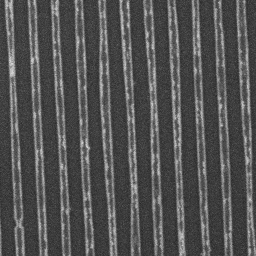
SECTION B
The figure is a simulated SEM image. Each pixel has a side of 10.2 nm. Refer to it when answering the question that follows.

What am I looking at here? parallel lines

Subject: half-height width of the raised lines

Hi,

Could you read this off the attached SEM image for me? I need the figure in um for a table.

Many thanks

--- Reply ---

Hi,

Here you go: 0.0711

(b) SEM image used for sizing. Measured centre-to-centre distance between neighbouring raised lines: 236 nm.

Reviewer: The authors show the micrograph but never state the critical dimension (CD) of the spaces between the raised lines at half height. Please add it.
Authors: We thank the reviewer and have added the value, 161 nanometers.